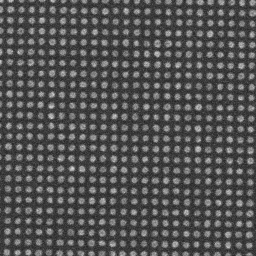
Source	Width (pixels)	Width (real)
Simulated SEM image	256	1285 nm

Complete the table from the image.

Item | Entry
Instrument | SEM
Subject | a regular array of raised bodies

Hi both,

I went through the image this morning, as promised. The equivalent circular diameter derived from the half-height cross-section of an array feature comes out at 27.2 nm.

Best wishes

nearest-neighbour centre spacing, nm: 51.2